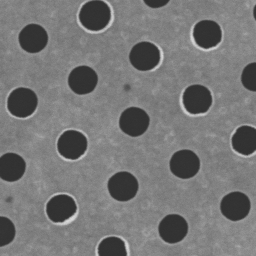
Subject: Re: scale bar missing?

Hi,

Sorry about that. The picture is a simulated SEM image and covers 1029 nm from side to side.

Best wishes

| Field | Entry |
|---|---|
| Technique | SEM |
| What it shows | a regular array of holes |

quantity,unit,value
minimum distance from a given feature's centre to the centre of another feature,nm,263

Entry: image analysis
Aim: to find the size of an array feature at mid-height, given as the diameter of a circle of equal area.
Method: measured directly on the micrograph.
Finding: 29.5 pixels